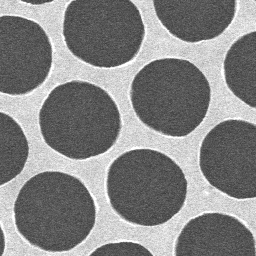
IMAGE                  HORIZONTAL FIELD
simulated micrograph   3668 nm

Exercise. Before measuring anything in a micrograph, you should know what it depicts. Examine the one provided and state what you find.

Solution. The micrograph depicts holes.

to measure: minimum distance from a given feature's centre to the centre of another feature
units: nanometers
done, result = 1350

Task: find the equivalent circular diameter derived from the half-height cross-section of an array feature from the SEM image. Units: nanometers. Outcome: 1140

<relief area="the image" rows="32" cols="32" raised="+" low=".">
++++.++++........++..........+++
++++++++.........++..........+++
....++++..........++.........+++
.....+++..........+++.......++++
......++..........++++.....+++..
......++..........+++++++++++...
.......++........+++++++++++....
.......+++......++++...+++++....
......++++++++++++.......+++....
......+++++++++++.........++....
.....+++....++++..........++....
....++.......+++..........+++...
++++++........++..........++++..
+++++..........++.........++++++
.++++..........++.........++++++
..+++..........+++.......++.....
...++..........+++++....++......
...+++.........++++++++++.......
....++........+++++++++++.......
....++++....+++......++++.......
...+++++++++++........+++.......
...+++.+++++++.........++.......
.+++......+++..........+++......
+++........++..........++++.....
++.........++..........++++++...
++..........++.........+++++++++
++..........++........++++++++++
++..........++++.....+++......++
++..........+++++++++++........+
.++........+++++++++++..........
.+++......+++....+++++..........
++++++++++++.......+++..........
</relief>